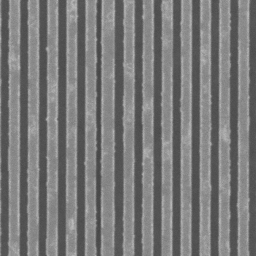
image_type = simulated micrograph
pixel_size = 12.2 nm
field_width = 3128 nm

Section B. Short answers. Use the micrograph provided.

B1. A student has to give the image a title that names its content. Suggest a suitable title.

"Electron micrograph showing parallel lines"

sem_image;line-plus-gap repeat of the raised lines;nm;234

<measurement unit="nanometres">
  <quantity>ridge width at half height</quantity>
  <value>126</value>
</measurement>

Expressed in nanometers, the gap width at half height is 112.